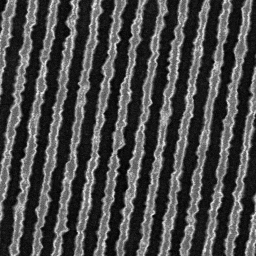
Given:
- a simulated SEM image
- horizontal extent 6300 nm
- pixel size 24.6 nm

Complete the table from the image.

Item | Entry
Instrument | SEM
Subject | parallel lines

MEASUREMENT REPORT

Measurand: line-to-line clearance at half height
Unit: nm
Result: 316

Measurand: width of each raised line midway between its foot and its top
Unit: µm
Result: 0.215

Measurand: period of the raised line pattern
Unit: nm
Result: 524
